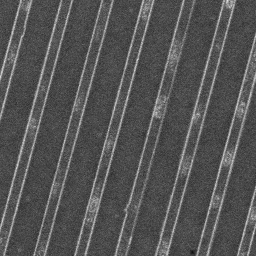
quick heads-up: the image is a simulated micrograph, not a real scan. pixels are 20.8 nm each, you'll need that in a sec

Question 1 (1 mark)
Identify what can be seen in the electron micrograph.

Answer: parallel lines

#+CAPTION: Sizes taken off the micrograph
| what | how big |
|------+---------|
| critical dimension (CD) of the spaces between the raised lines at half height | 608 nm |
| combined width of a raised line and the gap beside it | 818 nanometres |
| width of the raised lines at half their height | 0.216 microns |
